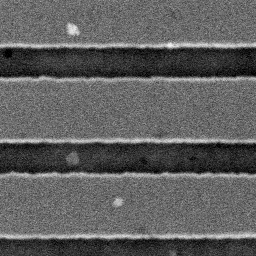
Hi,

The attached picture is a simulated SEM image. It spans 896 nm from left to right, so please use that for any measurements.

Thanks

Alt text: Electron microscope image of lines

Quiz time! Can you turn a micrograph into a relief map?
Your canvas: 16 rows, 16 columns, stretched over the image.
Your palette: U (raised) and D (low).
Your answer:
UUUUUUUUUUUUUUUU
UUUUUUUUUUUUUUUU
UUUUUUUUUUUUUUUU
DDDDDDDDDDDDDDDD
DDDDDDDDDDDDDDDD
UUUUUUUUUUUUUUUU
UUUUUUUUUUUUUUUU
UUUUUUUUUUUUUUUU
UUUUUUUUUUUUUUUU
DDDDDDDDDDDDDDDD
DDDDDDDDDDDDDDDD
UUUUUUUUUUUUUUUU
UUUUUUUUUUUUUUUU
UUUUUUUUUUUUUUUU
UUUUUUUUUUUUUUUU
DDDDDDDDDDDDDDDD